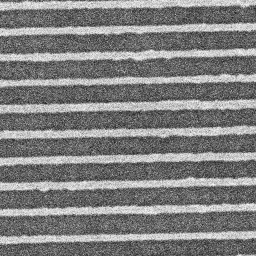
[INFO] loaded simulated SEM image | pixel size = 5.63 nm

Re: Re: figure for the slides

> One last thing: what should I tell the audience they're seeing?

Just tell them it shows parallel lines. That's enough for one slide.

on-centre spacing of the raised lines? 146 nanometers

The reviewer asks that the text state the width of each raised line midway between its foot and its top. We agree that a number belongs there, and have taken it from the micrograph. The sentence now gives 38 nanometres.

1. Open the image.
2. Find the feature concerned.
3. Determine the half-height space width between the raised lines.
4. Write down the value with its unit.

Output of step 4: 108 nanometers